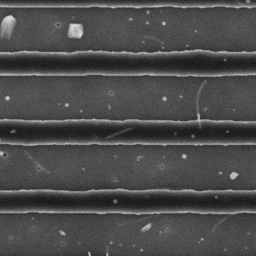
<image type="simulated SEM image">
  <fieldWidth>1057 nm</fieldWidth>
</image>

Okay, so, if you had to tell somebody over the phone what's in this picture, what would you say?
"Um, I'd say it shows lines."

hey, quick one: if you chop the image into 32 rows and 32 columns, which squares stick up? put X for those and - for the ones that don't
XXXXXXXXXXXXXXXXXXXXXXXXXXXXXXXX
--------------------------------
--------------------------------
---------X----------------------
--------------------------------
--------------------------------
--XXX----XXXXXXX-----XXXXXXXX-XX
XXXXXXXXXXXXXXXXXXXXXXXXXXXXXXXX
XXXXXXXXXXXXXXXXXXXXXXXXXXXXXXXX
--------------------------------
--------------------------------
--------------------------------
--------------------------------
--------------------------------
--------------------------------
XXXXXXXXXXXXXXXXXXXXXXXXXXXXXXXX
XXXXXXXXXXXXXXXXXXXXXXXXXXXXXXXX
XXXXXXXXXXXXXXXXXXXXXXXXXXXXXXXX
--------------------------------
--------------------------------
--------------------------------
--------------------------------
--------------------------------
--------------------------------
XXXXXXXXXXXXXXXXXXXXXXXXXXXXXXXX
XXXXXXXXXXXXXXXXXXXXXXXXXXXXXXXX
XXXXXXXXXXXXXXXXXXXXXXXXXXXXXXXX
--------------------------------
--------------------------------
--------------------------------
--------------------------------
--------------------------------